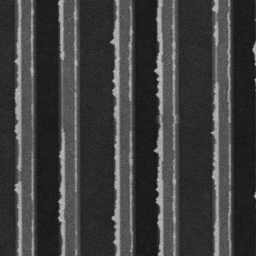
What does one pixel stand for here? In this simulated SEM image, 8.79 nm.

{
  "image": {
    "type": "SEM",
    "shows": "parallel lines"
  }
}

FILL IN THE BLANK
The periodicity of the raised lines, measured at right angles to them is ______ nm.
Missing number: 433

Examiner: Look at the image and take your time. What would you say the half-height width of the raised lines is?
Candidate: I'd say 160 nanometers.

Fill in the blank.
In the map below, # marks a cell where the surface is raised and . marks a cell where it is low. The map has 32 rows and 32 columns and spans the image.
..##...###....###...##.....##...
..##...###.....##...##.....##...
..##...###....###...##.....##...
..##....##....###...##.....##...
..##....##....###...##.....##...
..##....##....###...##.....##...
..##....##....###...##.....##...
..##....##....###...##.....##...
..##....##....###..###.....##...
..##....##....###...##.....##...
..##....##....###...##.....##...
..##....##....###...##.....##...
..##....##....###...##.....##...
..##....##....###...##.....##...
..##....##....###...##.....##...
..##....##....###...##.....##...
..##....##....###...##.....##...
..##....##....###...##.....##...
..##....##....###...##.....##...
..##...###....###...##.....##...
..##....##....###...##.....##...
..##....##....###...##.....##...
..##....##....###...##.....##...
..##....##....###...##.....##...
..##....##.....##...##.....##...
..##...###....###...##.....##...
..##...###....###...##.....##...
..##...###....###...##.....##...
..##....##....###...##.....##...
..##....##....###...##.....##...
..##....##....###...##.....##...
..##....##.....##...##.....##...